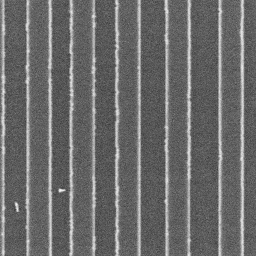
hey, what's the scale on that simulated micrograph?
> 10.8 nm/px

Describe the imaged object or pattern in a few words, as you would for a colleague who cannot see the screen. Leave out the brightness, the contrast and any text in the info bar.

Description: lines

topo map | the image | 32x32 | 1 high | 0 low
00011100011100011000011100001100
00011100011100011000011100001100
00011100011100011000011100001100
00011100011100011000011100011100
00011100011100011000011100001100
00011100011100011000011100011100
00011100011100011000011100001100
00011100011100011000011100001100
00011100011100011000011100001100
00011100011100011000011100001100
00011100011100011000011100011100
00011100011100011000011100011100
00001100011100011000011100001100
00011100011100011000011100011100
00011100011100011000011100001100
00011100011100011000011100001100
00011100011100011000011100001100
00011100011100011000011100001100
00001100011100011000011100001100
00011100011100011000011100001100
00001100011100011000011100001100
00011100011100011000011100011100
00011100011100011000011100011100
00011100011100011000011100001100
00011100011100011000011100001100
00011100011100011000011100001100
00011100011100011000011100011100
00011100011100011000011100001100
00011100011100011000011100011100
00011100011100011000011100011100
00011100011100011000011100011100
00011100011100011000011100001100